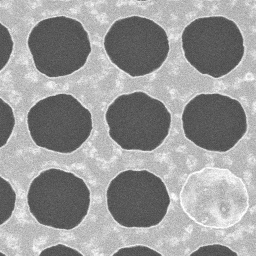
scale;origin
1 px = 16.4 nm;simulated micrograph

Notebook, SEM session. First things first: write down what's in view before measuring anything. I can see a regular array of holes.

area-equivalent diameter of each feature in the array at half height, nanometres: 1010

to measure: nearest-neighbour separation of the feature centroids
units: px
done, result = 76.2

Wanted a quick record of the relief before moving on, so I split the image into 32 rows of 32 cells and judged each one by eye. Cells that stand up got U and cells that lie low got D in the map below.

UUUUUUUUUUUUUUUUUUUUUUUUUUUUUUUU
UUUUUUUUUUUUUUUUUUUUUUUUUUUUUUUU
UUUUUDDDDUUUUUUDDDDUUUUUDDDDDUUU
DUUUDDDDDDUUUUDDDDDDUUUDDDDDDDUU
DUUUDDDDDDDUUDDDDDDDDUUDDDDDDDUU
DDUDDDDDDDDUUDDDDDDDDUUDDDDDDDUU
DUUUDDDDDDDUUDDDDDDDDUUDDDDDDDDU
DUUUDDDDDDDUUUDDDDDDDUUDDDDDDDUU
UUUUUDDDDDUUUUUDDDDDUUUUDDDDDUUU
UUUUUUDDUUUUUUUUDDUUUUUUUUDDUUUU
UUUUUUUUUUUUUUUUUUUUUUUUUUUUUUUU
UUUUUUUUUUUUUUUUUDUUUUUUUUUUUUUU
UUUUUDDDDDUUUUDDDDDDUUUUDDDDDUUU
DUUUDDDDDDDUUUDDDDDDDUUDDDDDDDUU
DDUDDDDDDDDUUDDDDDDDDUUDDDDDDDDU
DDUDDDDDDDDDUDDDDDDDDUUDDDDDDDDU
DDUUDDDDDDDUUUDDDDDDDUUDDDDDDDDU
DUUUDDDDDDDUUUDDDDDDUUUUDDDDDDUU
UUUUUUDDDDUUUUUDDDDUUUUUUDDDDUUU
UUUUUUUUUUUUUUUUUUUUUUUUUUUUUUUU
UUUUUUUUUUUUUUUUUUUUUUUUUUUUUUUU
UUUUUDDDUUUUUUUDDDDUUUUUUUUUUUUU
DUUUDDDDDDUUUUDDDDDDUUUUUUUUUUUU
DDUUDDDDDDDUUUDDDDDDDUUUUUUUUUUU
DDUDDDDDDDDUUDDDDDDDDUUUUUUUUUUU
DDUUDDDDDDDUUDDDDDDDDUUUUUUUUUUU
DDUUDDDDDDDUUUDDDDDDDUUUUUUUUUUU
DUUUUDDDDDUUUUDDDDDDUUUUUUUUUUUU
UUUUUUUDDUUUUUUUUUUUUUUUUUUUUUUU
UUUUUUUUUUUUUUUUUUUUUUUUUUUUUUUU
UUUUUUUUUUUUUUUUUUUUUUUUUUUUUUUU
UUUUUDDDDDUUUUUDDDDDUUUUDDDDDUUU